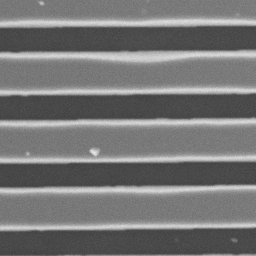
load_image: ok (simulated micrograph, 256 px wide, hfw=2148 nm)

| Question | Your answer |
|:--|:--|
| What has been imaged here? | lines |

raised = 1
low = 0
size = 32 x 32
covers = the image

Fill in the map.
11111111111111111111111111111111
11111111111111111111111111111111
11111111111111111111111111111111
00000000000000000000000000000000
00000000000000000000000000000000
00000000000000000000000000000000
00000000000000000000000000000000
11111111111111111111111111111111
11111111111111111111111111111111
11111111111111111111111111111111
11111111111111111111111111111111
11111111111111111111111111000111
00000000000000000000000000000000
00000000000000000000000000000000
00000000000000000000000000000000
11111111111111111111111111111111
11111111111111111111111111111111
11111111111111111111111111111111
11111111111111111111111111111111
11111111111111111111111111111111
00000000000000000000000000000000
00000000000000000000000000000000
00000000000000000000000000000000
00000000000000010000001111111111
11111111111111111111111111111111
11111111111111111111111111111111
11111111111111111111111111111111
11111111111111111111111111111111
11111111111111110000000000000000
00000000000000000000000000000000
00000000000000000000000000000000
00000000000000000000000000000000